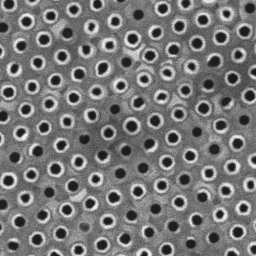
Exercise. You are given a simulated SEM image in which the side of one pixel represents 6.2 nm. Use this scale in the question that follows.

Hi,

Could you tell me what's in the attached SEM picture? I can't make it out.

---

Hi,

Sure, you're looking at a regular array of holes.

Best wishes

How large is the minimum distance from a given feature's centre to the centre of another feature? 148 nanometres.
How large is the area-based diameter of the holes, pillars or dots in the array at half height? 63 nm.